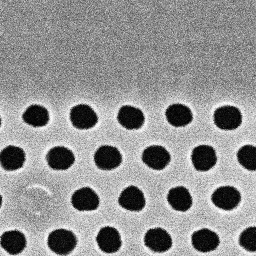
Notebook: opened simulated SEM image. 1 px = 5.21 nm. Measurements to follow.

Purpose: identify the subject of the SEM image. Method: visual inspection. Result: a regular array of holes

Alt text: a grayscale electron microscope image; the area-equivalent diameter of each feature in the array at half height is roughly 141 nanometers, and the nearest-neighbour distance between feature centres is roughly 243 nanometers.